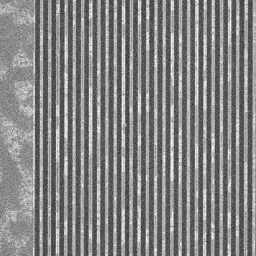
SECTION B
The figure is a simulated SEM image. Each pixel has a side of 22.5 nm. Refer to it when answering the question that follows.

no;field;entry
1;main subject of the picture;parallel lines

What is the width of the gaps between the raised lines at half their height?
132 nm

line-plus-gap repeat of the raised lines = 184 nanometres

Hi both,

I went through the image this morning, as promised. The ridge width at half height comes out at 56.3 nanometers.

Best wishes